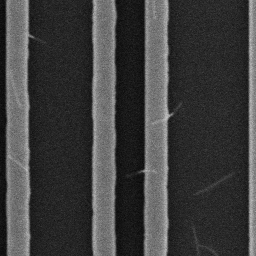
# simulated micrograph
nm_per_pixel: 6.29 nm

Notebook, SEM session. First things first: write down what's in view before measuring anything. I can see lines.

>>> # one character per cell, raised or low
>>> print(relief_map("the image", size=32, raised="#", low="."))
.###........##....###..........#
.###........###...###..........#
.###........###...###..........#
.###........##....###..........#
.###........##....###..........#
.###........##....###..........#
.###........##....###..........#
.###........##....###..........#
.##.........##....###..........#
.##.........##....###..........#
.##.........##....###..........#
.###........##....###..........#
.###........##....###..........#
.###........##....###..........#
.###........##....###..........#
.###........##....###..........#
.###........##....###..........#
.###........##....###..........#
.###........##....###..........#
.###........##....###..........#
.###........##....###..........#
.###........##....###..........#
.###........##....###..........#
.###........##....###..........#
.###........##....###..........#
.###........##....###..........#
.###........##....###..........#
.###........##....###..........#
.###........##....###..........#
.###........##....###..........#
.###........##....###..........#
.###........##....###..........#